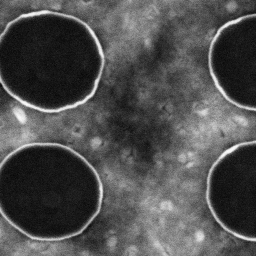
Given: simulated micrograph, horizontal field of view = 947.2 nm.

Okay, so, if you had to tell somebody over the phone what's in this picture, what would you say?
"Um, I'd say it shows raised bodies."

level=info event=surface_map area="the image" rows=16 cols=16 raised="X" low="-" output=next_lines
----------------
-XXXX---------XX
XXXXXX-------XXX
XXXXXX-------XXX
XXXXXX-------XXX
XXXXXX--------XX
-XXXX----------X
----------------
----------------
-XXXX---------XX
XXXXXX-------XXX
XXXXXX-------XXX
XXXXXX-------XXX
XXXXXX-------XXX
-XXXX---------XX
----------------